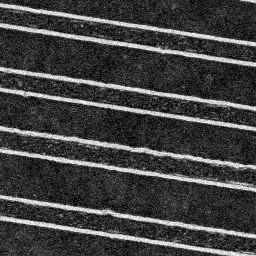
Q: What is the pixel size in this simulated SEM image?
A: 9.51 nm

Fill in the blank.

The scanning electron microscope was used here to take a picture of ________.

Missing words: one or a few lines or trenches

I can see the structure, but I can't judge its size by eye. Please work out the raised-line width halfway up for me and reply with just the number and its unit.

0.207 um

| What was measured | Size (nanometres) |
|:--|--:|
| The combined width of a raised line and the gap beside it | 601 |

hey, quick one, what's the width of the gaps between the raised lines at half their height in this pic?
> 41.7 pixels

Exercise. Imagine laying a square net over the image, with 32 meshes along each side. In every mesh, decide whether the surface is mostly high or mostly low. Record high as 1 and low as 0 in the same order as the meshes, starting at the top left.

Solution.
00000000000000000000000000000000
11111100000000000000000000000000
11111111111100000000000000000000
00111111111111111110000000000000
00000000111111111111111110000000
00000000000000011111111111111110
00000000000000000000011111111111
00000000000000000000000000001111
00000000000000000000000000000000
11111100000000000000000000000000
11111111111100000000000000000000
01111111111111111110000000000000
00000000011111111111111110000000
00000000000000111111111111111110
00000000000000000000011111111111
00000000000000000000000000001111
11100000000000000000000000000000
11111111110000000000000000000000
11111111111111110000000000000000
00001111111111111111110000000000
00000000000111111111111111111000
00000000000000000111111111111111
00000000000000000000000111111111
00000000000000000000000000000011
00000000000000000000000000000000
11111100000000000000000000000000
11111111111101000000000000000000
01111111111111111110000000000000
00000000111111111111111110000000
00000000000000111111111111111110
00000000000000000000011111111111
00000000000000000000000000011111